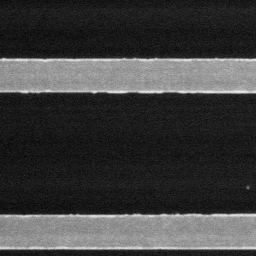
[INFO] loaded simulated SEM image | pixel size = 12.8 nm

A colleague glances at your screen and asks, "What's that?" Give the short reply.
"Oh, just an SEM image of lines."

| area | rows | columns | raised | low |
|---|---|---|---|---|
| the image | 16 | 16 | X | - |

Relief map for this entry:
----------------
----------------
----------------
----------------
XXXXXXXXXXXXXXXX
XXXXXXXXXXXXXXXX
----------------
----------------
----------------
----------------
----------------
----------------
----------------
XXXXXXXXXXXXXXXX
XXXXXXXXXXXXXXXX
XXXXXXXXXXXXXXXX